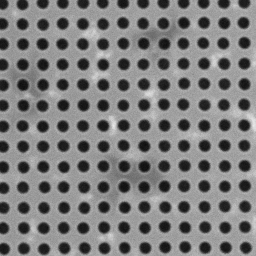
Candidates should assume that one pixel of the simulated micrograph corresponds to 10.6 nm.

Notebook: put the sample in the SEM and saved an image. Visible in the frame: a regular array of holes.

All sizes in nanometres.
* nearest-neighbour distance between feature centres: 211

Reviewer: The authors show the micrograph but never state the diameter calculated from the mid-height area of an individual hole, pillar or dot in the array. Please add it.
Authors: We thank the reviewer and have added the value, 0.134 microns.